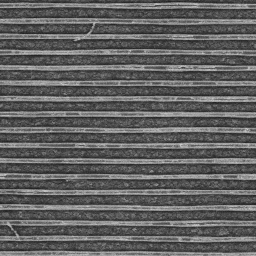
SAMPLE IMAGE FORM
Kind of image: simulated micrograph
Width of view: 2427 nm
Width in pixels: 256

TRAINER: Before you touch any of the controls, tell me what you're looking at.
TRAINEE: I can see parallel lines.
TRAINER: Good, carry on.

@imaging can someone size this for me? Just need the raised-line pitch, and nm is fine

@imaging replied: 147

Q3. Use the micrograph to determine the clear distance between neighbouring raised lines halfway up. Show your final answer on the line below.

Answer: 0.109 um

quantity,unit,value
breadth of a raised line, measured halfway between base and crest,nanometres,34.4